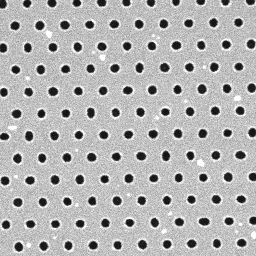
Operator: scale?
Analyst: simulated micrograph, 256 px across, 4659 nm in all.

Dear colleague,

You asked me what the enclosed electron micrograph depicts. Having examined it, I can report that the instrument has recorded a regular array of holes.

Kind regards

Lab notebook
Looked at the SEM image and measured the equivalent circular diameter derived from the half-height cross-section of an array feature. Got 169 nanometers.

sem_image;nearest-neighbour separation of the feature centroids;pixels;24.4